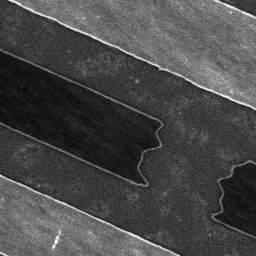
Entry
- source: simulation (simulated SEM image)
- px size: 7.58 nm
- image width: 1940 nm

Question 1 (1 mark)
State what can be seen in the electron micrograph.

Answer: one or a few lines or trenches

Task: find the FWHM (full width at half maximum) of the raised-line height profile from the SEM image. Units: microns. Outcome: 0.514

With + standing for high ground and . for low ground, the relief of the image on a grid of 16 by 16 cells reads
..+++++++++++++.
....++++++++++++
......++++++++++
+.......++++++++
+++........+++++
+++++........+++
++++++++.......+
++++++++++......
..++++++++......
....+++++.......
......+++......+
+.............++
++++..........++
++++++........++
++++++++.......+
++++++++++......